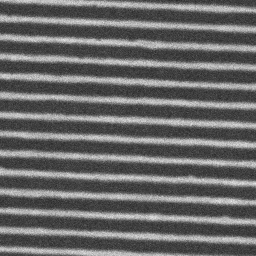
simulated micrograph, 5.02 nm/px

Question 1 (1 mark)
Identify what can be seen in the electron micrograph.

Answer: parallel lines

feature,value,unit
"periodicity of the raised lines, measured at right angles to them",96.5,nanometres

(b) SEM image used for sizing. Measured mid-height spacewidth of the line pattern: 65.2 nm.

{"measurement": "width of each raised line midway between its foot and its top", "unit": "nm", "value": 30.1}